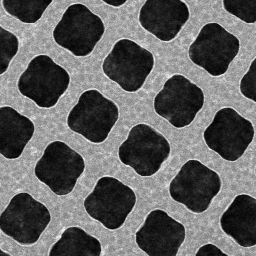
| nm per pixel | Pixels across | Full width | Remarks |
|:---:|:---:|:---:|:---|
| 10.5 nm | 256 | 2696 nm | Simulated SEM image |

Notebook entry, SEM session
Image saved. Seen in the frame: a regular array of holes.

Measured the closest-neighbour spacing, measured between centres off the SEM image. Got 0.639 um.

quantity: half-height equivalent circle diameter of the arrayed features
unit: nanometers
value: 510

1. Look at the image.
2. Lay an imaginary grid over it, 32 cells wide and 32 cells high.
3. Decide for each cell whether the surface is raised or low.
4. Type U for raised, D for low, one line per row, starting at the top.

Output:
DDDDDDUUUUUUUDDUUUDDDDDUUUUUDDDD
UDDDDUUUDDDUUUUUUDDDDDDDUUUUDDDD
UUDDDUUUDDDDDUUUUDDDDDDUUUUUUUDD
UUUUUUUDDDDDDUUUUUDDDDDUUDDDUUUU
DDUUUUUDDDDDDUUUUUUDDDUUUDDDDUUU
DDUUUUUDDDDDUUDDDUUUUUUUDDDDDDUU
DDUUUUUUUDDUUUDDDDDUUUUUDDDDDDUU
DUUUDDDUUUUUUDDDDDDUUUUUDDDDDUUU
DUUDDDDDUUUUUDDDDDDUUUUUUDDDUUUD
UUUDDDDDDUUUUDDDDDDUUUDUUUUUUUDD
UUDDDDDDDUUUUUUDDDUUUDDDUUUUUUDD
UUUDDDDDUUUDUUUUDUUUDDDDDUUUUUDD
UUUUDDDUUUDDDDUUUUUDDDDDDUUUUUUD
DUUUUUUUUDDDDDDUUUUDDDDDDUUUDUUU
DDDUUUUUUDDDDDDUUUUUDDDDUUUDDDUU
DDDDUUUUUDDDDDUUUUUUUDDDUUDDDDDU
DDDDUUUUUDDDDDUUDDDDUUUUUUDDDDDD
DDDDUUUUUUUDDUUUDDDDDUUUUUDDDDDD
DDDUUUDDDUUUUUUDDDDDDUUUUUDDDDDU
DDUUUDDDDDUUUUUDDDDDDUUUUUUUDDUU
UUUUUDDDDDDUUUUUDDDDUUUDDUUUUUUU
UUUUDDDDDDUUUUUUUDDUUUDDDDDUUUUU
UUUUUDDDDDUUDDDUUUUUUUDDDDDDUUUU
UUUUUUDDDUUUDDDDUUUUUDDDDDDDUUUU
UUDDUUUUUUUDDDDDDUUUUDDDDDDUUUDU
UDDDDUUUUUUDDDDDDUUUUUUDDDUUUDDD
DDDDDDUUUUUDDDDDUUUDDUUUDUUUDDDD
DDDDDDUUUUUUDDDDUUDDDDUUUUUUDDDD
DDDDDDUUUDUUUDDUUUDDDDDUUUUUDDDD
UDDDDUUUDDDUUUUUUDDDDDDUUUUUUDDD
UUUDUUUDDDDDUUUUUDDDDDDUUUUUUUDD
UUUUUUDDDDDDDUUUUUDDDDUUUDDDUUUU